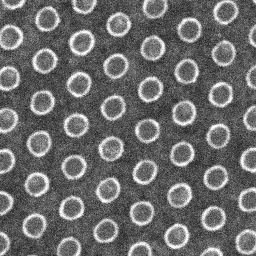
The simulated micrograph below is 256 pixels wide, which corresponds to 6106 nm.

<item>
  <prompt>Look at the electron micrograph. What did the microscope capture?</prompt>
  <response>a regular array of raised bodies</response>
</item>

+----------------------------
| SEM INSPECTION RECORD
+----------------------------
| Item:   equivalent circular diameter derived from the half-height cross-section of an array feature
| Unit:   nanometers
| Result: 547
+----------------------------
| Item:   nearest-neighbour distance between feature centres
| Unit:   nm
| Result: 975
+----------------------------